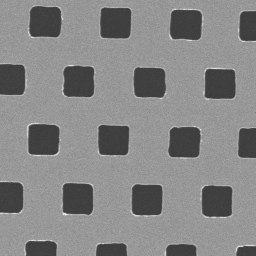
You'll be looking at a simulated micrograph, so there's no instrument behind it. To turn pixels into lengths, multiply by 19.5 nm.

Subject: a regular array of holes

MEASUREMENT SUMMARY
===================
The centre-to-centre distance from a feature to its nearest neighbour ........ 1330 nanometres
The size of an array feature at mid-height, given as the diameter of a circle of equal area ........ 664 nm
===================